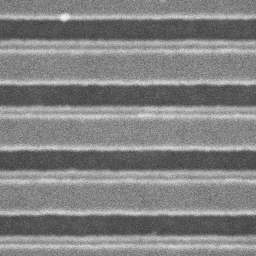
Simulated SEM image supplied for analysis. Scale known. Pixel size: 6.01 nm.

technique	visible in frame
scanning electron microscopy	lines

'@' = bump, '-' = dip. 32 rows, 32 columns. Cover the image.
@@@@@@@@@@@@@@@@@@@@@@@@@@@@@@@@
@@@@@@@@@@@@@@@@@@@@@@@@@@@@@@@@
--------------------------------
--------------------------------
--------------------------------
@@@@@@@@@@@@@@@@@@@@@@@@@@@@@@@@
@@@@@@@@@@@@@@@@@@@@@@@@@@@@@@@@
@@@@@@@@@@@@@@@@@@@@@@@@@@@@@@@@
@@@@@@@@@@@@@@@@@@@@@@@@@@@@@@@@
@@@@@@@@@@@@@@@@@@@@@@@@@@@@@@@@
--@------------@-@-----@------@-
--------------------------------
--------------------------------
@--@@@-@@@--------@@@@----------
@@@@@@@@@@@@@@@@@@@@@@@@@@@@@@@@
@@@@@@@@@@@@@@@@@@@@@@@@@@@@@@@@
@@@@@@@@@@@@@@@@@@@@@@@@@@@@@@@@
@@@@@@@@@@@@@@@@@@@@@@@@@@@@@@@@
@@@@@@@@@@@@@@@@@@@@@@@@@@@@@@@@
--------------------------------
--------------------------------
--------@@----------------------
@@@@@@@@@@@@@@@@@@@@@@@@@@@@@@@@
@@@@@@@@@@@@@@@@@@@@@@@@@@@@@@@@
@@@@@@@@@@@@@@@@@@@@@@@@@@@@@@@@
@@@@@@@@@@@@@@@@@@@@@@@@@@@@@@@@
@@@@@@@@@@@@@@@@@@@@@@@@@@@@@@@@
--------------------------------
--------------------------------
--------------------------------
@@@@@@@@@@@@@@@@@@@@@@@@@@@@@@@@
@@@@@@@@@@@@@@@@@@@@@@@@@@@@@@@@